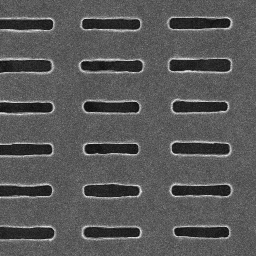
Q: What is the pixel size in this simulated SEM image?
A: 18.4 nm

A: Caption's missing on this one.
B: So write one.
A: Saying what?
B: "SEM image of a regular array of holes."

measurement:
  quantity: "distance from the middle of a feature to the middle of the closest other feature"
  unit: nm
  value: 761